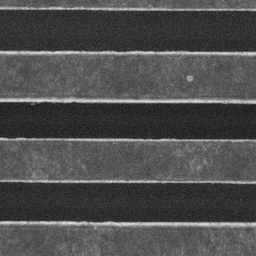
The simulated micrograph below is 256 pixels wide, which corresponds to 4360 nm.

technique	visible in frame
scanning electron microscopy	lines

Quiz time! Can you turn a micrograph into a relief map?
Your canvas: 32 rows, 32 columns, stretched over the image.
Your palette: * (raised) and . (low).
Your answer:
********************************
................................
................................
................................
................................
................................
****.*.*****.**.***..***........
********************************
********************************
********************************
********************************
********************************
********************************
................................
................................
................................
................................
****************................
********************************
********************************
********************************
********************************
********************************
................................
................................
................................
................................
................................
********************************
********************************
********************************
********************************